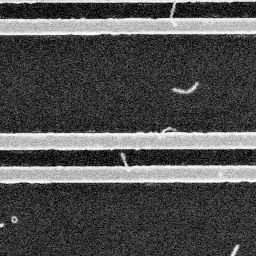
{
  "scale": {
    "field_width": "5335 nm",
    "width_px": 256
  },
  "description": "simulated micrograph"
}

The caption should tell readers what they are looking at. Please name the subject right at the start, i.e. lines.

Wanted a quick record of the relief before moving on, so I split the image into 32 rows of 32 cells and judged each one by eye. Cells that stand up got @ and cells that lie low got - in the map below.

--------------------------------
--------------------------------
@@@@@@@@@@@@@@@@@@@@@@@@@@@@@@@@
@@@@@@@@@@@@@@@@@@@@@@@@@@@@@@@@
--------------------------------
--------------------------------
--------------------------------
--------------------------------
--------------------------------
--------------------------------
--------------------------------
--------------------------------
--------------------------------
--------------------------------
--------------------------------
--------------------------------
--------------------------------
@@@@@@@@@@@@@@@@@@@@@@@@@@@@@@@@
@@@@@@@@@@@@@@@@@@@@@@@@@@@@@@@@
--------------------------------
--------------------------------
@@@@@@@@@@@@@@@@@@@@@@@@@@@@@@@@
@@@@@@@@@@@@@@@@@@@@@@@@@@@@@@@@
--------------------------------
--------------------------------
--------------------------------
--------------------------------
--------------------------------
--------------------------------
--------------------------------
--------------------------------
--------------------------------